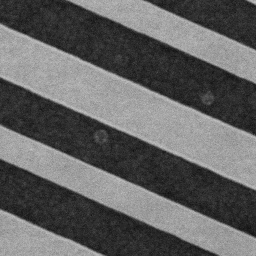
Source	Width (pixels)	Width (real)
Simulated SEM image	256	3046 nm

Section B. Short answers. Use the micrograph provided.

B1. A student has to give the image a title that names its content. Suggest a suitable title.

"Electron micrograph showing lines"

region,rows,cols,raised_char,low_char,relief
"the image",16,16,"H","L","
LLLLLHHHHHLLLLLL
LLLLLLLLHHHHLLLL
HHLLLLLLLLHHHHHL
HHHHHLLLLLLLHHHH
HHHHHHHLLLLLLLHH
LLHHHHHHHLLLLLLL
LLLLHHHHHHHLLLLL
LLLLLLHHHHHHHHLL
HLLLLLLLHHHHHHHH
HHHHLLLLLLLHHHHH
LHHHHHLLLLLLLHHH
LLLLHHHHLLLLLLLH
LLLLLLHHHHHLLLLL
HLLLLLLLHHHHHLLL
HHHLLLLLLLHHHHHL
HHHHHLLLLLLLLHHH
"